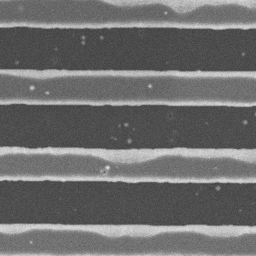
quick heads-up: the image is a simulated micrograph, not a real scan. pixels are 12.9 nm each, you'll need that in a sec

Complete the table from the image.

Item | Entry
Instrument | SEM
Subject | lines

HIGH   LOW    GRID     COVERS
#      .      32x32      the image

################################
################################
################################
.....##.#####..........#########
................................
................................
................................
................................
................................
################################
################################
################################
################################
................................
................................
................................
................................
................................
................................
################################
################################
################################
##.#############################
................................
................................
................................
................................
................................
#############.......######......
################################
################################
################################